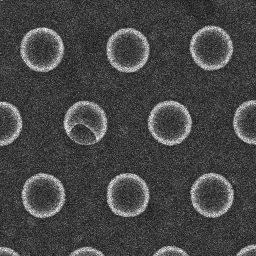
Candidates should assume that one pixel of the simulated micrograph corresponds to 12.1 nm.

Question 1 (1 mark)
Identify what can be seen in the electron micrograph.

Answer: a regular array of raised bodies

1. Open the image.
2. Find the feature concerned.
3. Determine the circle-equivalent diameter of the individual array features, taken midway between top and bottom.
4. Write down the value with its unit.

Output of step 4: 486 nanometres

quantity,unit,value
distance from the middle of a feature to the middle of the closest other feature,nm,1010